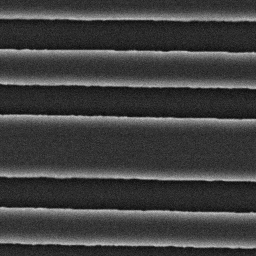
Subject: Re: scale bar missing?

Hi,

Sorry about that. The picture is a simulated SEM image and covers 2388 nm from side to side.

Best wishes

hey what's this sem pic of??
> lines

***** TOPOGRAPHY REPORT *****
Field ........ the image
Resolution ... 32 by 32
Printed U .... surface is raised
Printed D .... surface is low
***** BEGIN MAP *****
UUUUUUUUUUUUUUUUUUUUUUUUUUUUUUUU
UUUUUUUUUUUUUUUUUUUUUUUUUUUUUUUU
DDDDDDDDDDDDDDDDDDDDDDUUDDDUUUUU
DDDDDDDDDDDDDDDDDDDDDDDDDDDDDDDD
DDDDDDDDDDDDDDDDDDDDDDDDDDDDDDDD
DDDDDDDDDDDDDDDDDDDDDDDDDDDDDDDD
UUUUUUUUUUUUUUUUUUUUUUUUDDDDDDDD
UUUUUUUUUUUUUUUUUUUUUUUUUUUUUUUU
UUUUUUUUUUUUUUUUUUUUUUUUUUUUUUUU
UUUUUUUUUUUUUUUUUUUUUUUUUUUUUUUU
UUUUUUUUUUUUUUUUUUUUUUUUUUUUUUUU
DDDDDDDDDDDDDDDDDDDDDDDDDDDDDDDD
DDDDDDDDDDDDDDDDDDDDDDDDDDDDDDDD
DDDDDDDDDDDDDDDDDDDDDDDDDDDDDDDD
UUUUUUDDDDDDDDDDDDDDDDDDDDDDDDDD
UUUUUUUUUUUUUUUUUUUUUUUUUUUUUUUU
UUUUUUUUUUUUUUUUUUUUUUUUUUUUUUUU
UUUUUUUUUUUUUUUUUUUUUUUUUUUUUUUU
UUUUUUUUUUUUUUUUUUUUUUUUUUUUUUUU
UUUUUUUUUUUUUUUUUUUUUUUUUUUUUUUU
UUUUUUUUUUUUUUUUUUUUUUUUUUUUUUUU
UUUUUUUUUUUUUUUUUUUUUUUUUUUUUUUU
DDDDDDDDDDDDDDDDDDDDDDDDDDDDUUUU
DDDDDDDDDDDDDDDDDDDDDDDDDDDDDDDD
DDDDDDDDDDDDDDDDDDDDDDDDDDDDDDDD
DDDDDDDDDDDDDDDDDDDDDDDDDDDDDDDD
UUUUUUUUUUUUUUUUUUUUUUUDDDDDDDDD
UUUUUUUUUUUUUUUUUUUUUUUUUUUUUUUU
UUUUUUUUUUUUUUUUUUUUUUUUUUUUUUUU
UUUUUUUUUUUUUUUUUUUUUUUUUUUUUUUU
DDDDDDDUUUUUUUUUUUUUUUUUUUUUUUUU
DDDDDDDDDDDDDDDDDDDDDDDDDDDDDDDD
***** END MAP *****